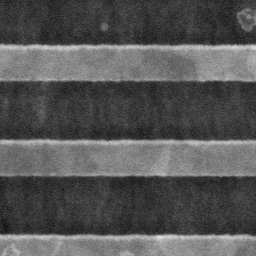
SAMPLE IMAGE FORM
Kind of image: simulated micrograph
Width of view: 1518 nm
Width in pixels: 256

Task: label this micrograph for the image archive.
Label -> lines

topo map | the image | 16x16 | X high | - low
----------------
----------------
----------------
XXXXXXXXXXXXXXXX
XXXXXXXXXXXXXXXX
----------------
----------------
----------------
----------------
XXXXXXXXXXXXXXXX
XXXXXXXXXXXXXXXX
----------------
----------------
----------------
----------------
XXXXXXXXXXXXXXXX